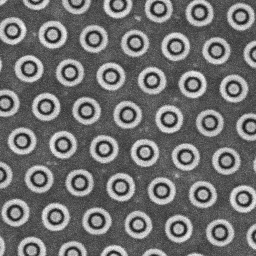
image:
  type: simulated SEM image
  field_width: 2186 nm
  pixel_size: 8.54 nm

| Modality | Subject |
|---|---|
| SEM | a regular array of ring-shaped raised bodies with a dot in the middle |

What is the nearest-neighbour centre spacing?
348 nm